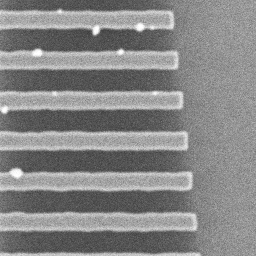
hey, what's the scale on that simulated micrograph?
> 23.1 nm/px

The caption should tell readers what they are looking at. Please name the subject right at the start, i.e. groups of lines, slits or small figures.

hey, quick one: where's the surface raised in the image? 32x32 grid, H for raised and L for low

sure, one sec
LLLLLLLLLLLLLLLLLLLLLLLLLLLLLLLL
HHHHHHHHHHHHHLHHHHHHHLLLLLLLLLLL
HHHHHHHHHHHHHHHHHHHHHHLLLLLLLLLL
HLLLLLLHHLLHHLHHHHHHHLLLLLLLLLLL
LLLLLLLLLLLLLLLLLLLLLLLLLLLLLLLL
LLLLLLLLLLLLLLLLLLLLLLLLLLLLLLLL
LLHHHHLLLLLLLHHHHHHLLHLLLLLLLLLL
HHHHHHHHHHHHHHHHHHHHHHLLLLLLLLLL
HHHHHHHHHHHHHHHHHHHHHHLLLLLLLLLL
LLLLLLLLLLLLLLLLLLLLLLLLLLLLLLLL
LLLLLLLLLLLLLLLLLLLLLLLLLLLLLLLL
HHLLHHHHHHHLLHHHHHLHHHLLLLLLLLLL
HHHHHHHHHHHHHHHHHHHHHHHLLLLLLLLL
HHHHHHHHHHHHHHHHHHHHHHLLLLLLLLLL
LLLLLLLLLLLLLLLLLLLLLLLLLLLLLLLL
LLLLLLLLLLLLLLLLLLLLLLLLLLLLLLLL
HLLLLLHLHHHLLLLLLLLLLLHLLLLLLLLL
HHHHHHHHHHHHHHHHHHHHHHHLLLLLLLLL
HHHHHHHHHHHHHHHHHHHHHHHLLLLLLLLL
LLLLLLLLLLLLLLLLLLLLLLLLLLLLLLLL
LLLLLLLLLLLLLLLLLLLLLLLLLLLLLLLL
LHHLLLLLLLLLLLLLLLLLLLLLLLLLLLLL
HHHHHHHHHHHHHHHHHHHHHHHHLLLLLLLL
HHHHHHHHHHHHHHHHHHHHHHHHLLLLLLLL
LLLLLLLLLLLLLLLLLLLLLLLLLLLLLLLL
LLLLLLLLLLLLLLLLLLLLLLLLLLLLLLLL
LLLLLLLLLLLLLLLLLLLLLLLLLLLLLLLL
HHHHHHHHHHHHHHHHHHHHHHHHHLLLLLLL
HHHHHHHHHHHHHHHHHHHHHHHHLLLLLLLL
LLLLLLLLLLLLLLLLLLLLLLLLLLLLLLLL
LLLLLLLLLLLLLLLLLLLLLLLLLLLLLLLL
LLLLLLLLLLLLLLLLLLLLLLLLLLLLLLLL